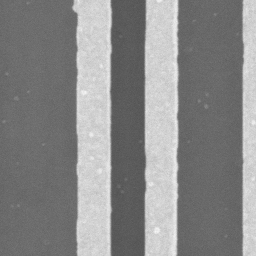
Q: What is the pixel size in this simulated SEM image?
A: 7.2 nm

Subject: lines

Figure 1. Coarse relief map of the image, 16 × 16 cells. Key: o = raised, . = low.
.....oo..oo....o
.....oo..oo....o
.....oo..oo....o
.....oo..oo....o
.....oo..oo....o
.....oo..oo....o
.....oo..oo....o
.....oo..oo....o
.....oo..oo....o
.....oo..oo....o
.....oo..oo....o
.....oo..oo....o
.....oo..oo....o
.....oo..oo....o
.....oo..oo....o
.....oo..oo....o